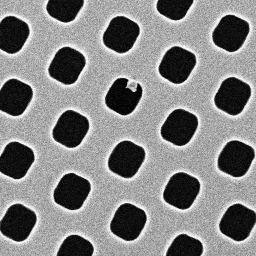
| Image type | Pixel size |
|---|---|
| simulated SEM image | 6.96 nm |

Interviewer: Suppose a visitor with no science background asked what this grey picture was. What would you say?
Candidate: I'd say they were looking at a regular array of holes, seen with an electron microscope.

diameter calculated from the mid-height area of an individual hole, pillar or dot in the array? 248 nanometers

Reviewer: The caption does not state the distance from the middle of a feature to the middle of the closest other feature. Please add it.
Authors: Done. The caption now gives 431 nanometers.